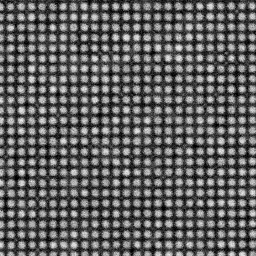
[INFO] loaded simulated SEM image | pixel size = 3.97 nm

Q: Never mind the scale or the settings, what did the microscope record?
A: a regular array of raised bodies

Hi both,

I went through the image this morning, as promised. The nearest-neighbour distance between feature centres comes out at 0.0397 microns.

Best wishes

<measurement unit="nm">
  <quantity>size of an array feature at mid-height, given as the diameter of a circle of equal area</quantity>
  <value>28.4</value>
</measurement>